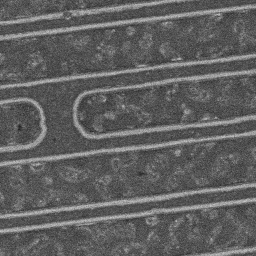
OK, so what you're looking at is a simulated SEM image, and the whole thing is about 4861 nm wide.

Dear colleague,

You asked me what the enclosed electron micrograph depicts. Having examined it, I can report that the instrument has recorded one or a few lines or trenches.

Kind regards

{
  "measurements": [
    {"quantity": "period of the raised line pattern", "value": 1220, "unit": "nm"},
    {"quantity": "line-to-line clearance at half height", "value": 940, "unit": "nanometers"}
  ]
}